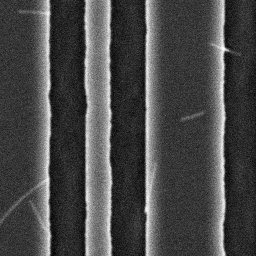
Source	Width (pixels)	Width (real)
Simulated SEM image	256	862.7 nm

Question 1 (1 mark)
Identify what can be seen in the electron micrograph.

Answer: lines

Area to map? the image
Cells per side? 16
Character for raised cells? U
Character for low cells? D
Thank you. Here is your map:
UUUDDUUDDUUUUUDD
UUUDDUUDDUUUUUDD
UUUDDUUDDUUUUUDD
UUUDDUUDDUUUUUDD
UUUDDUUDDUUUUUDD
UUUDDUUDDUUUUUDD
UUUDDUUDDUUUUUDD
UUUDDUUDDUUUUUDD
UUUDDUUDDUUUUUDD
UUUDDUUDDUUUUUDD
UUUDDUUDDUUUUUDD
UUUDDUUDDUUUUUDD
UUUDDUUDDUUUUUDD
UUUDDUUDDUUUUUDD
UUUDDUUDDUUUUUDD
UUUDDUUDDUUUUUDD